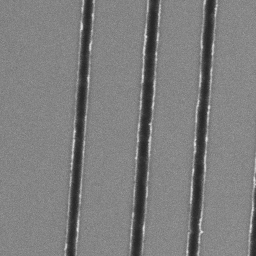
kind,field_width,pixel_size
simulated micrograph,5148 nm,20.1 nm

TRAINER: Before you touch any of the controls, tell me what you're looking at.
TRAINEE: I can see one or a few lines or trenches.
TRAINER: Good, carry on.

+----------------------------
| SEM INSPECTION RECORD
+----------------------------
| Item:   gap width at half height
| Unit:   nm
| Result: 993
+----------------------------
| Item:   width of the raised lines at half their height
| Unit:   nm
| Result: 252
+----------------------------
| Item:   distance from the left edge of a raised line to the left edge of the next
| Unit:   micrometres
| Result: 1.23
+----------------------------